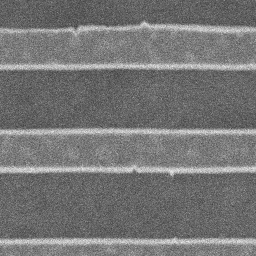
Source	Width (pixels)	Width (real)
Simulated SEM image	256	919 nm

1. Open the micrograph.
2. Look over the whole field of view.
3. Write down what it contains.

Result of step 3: one or a few lines or trenches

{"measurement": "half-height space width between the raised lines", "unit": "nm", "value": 232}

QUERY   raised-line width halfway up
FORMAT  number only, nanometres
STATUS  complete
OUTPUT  147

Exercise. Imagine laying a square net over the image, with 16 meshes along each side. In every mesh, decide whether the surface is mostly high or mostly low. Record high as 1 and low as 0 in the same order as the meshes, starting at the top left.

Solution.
0000000000000000
0000000001000000
1111111111111111
1111111111111111
0000000000000000
0000000000000000
0000000000000000
0000000000000000
1111111111111111
1111111111111111
1111111111111111
0000000000000000
0000000000000000
0000000000000000
0000000000000000
1111111111111111